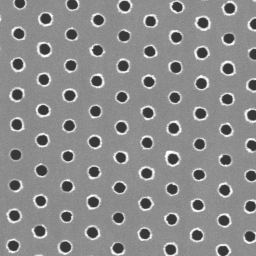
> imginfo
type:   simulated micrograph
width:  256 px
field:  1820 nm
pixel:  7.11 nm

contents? a regular array of holes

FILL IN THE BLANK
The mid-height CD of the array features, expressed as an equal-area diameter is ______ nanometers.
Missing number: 75.7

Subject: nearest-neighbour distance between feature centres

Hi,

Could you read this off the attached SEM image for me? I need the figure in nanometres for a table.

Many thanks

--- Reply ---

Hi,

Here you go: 214